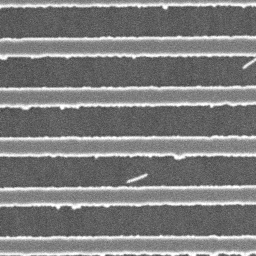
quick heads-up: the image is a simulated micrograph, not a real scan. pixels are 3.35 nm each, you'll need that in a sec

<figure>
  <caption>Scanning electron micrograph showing lines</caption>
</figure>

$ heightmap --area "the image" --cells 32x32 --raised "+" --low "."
++++++++++++++++++++++++++++++++
................................
................................
................................
..............................+.
++++++++++++++++++++++++++++++++
++++++++++++++++++++++++++++++++
................................
................................
................................
................................
++++++++++++++++++++++++++++++++
++++++++++++++++++++++++++++++++
................................
................................
................................
................................
++++++++++++++++++++++++++++++++
++++++++++++++++++++++++++++++++
........+.............+.........
................................
................................
................................
......+.++++++++++++++++++++++++
++++++++++++++++++++++++++++++++
+++++++++++++++++++++++++++++.+.
................................
................................
................................
...............+++..+++++.+..+++
++++++++++++++++++++++++++++++++
++++++++++++++++++++++++++++++++